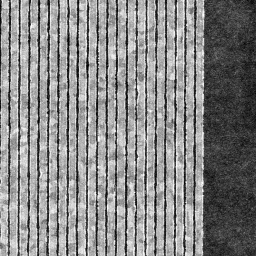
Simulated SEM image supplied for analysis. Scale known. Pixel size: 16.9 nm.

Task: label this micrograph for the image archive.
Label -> parallel lines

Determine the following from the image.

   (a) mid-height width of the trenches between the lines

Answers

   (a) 48.6 nm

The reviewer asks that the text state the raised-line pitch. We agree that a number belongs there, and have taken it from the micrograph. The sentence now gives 165 nm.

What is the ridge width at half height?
112 nm